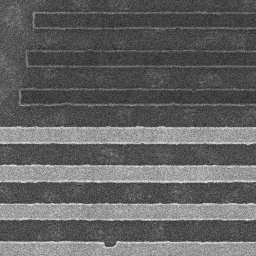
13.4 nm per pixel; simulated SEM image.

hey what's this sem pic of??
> parallel lines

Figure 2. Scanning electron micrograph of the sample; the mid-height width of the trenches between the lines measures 308 nm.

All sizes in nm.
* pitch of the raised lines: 513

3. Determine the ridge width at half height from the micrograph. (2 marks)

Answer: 206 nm